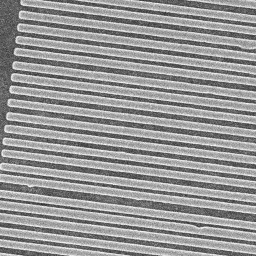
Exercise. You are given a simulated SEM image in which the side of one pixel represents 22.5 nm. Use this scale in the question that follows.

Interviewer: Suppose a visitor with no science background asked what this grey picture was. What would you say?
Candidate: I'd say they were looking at parallel lines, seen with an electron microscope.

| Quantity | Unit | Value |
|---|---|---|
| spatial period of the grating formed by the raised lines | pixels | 12.7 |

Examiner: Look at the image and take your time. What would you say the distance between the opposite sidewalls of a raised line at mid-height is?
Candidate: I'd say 170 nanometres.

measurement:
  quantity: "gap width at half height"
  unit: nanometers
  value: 109